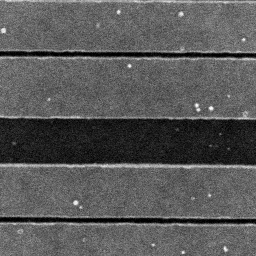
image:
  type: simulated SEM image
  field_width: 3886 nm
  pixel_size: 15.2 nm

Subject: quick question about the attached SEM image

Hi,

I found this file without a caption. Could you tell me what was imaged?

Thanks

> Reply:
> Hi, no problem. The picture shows lines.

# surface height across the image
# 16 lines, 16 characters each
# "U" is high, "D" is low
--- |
UUUUUUUUUUUUUUUU
UUUUUUUUUUUUUUUU
UUUUUUUUUUUUUUUU
UUUUUUUUUUUUUUUU
UUUUUUUUUUUUUUUU
UUUUUUUUUUUUUUUU
UUUUUUUUUUUUUUUU
DDDDDDDDDDDDDDDD
DDDDDDDDDDDDDDDD
DDDDDDDDDDDDDDDD
UUUUUUUUUUUUUUUU
UUUUUUUUUUUUUUUU
UUUUUUUUUUUUUUUU
UUUUUUUUUUUUUUUU
UUUUUUUUUUUUUUUU
UUUUUUUUUUUUUUUU